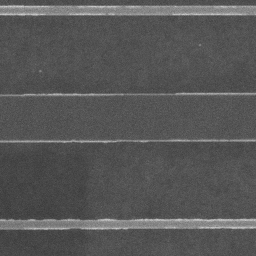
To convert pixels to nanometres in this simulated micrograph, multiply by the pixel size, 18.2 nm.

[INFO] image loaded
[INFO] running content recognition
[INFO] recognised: lines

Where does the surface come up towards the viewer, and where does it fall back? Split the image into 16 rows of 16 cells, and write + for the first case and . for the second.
+.++++++++++++++
................
................
................
................
................
++++++++++++++++
++++++++++++++++
++++++++++++++++
................
................
................
................
................
................
................